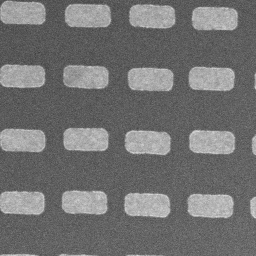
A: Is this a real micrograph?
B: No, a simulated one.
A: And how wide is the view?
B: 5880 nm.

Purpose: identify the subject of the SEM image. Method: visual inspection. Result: a regular array of raised bodies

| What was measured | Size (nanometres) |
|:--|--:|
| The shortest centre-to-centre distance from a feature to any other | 1430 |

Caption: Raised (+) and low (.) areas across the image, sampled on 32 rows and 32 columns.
+++++...........................
++++++..++++++..++++++..+++++...
+++++...++++++..++++++..++++++..
.........................++++...
................................
................................
................................
................................
+++++...+++++...........++......
+++++...+++++...++++++..+++++...
+++++...+++++...++++++..+++++...
................................
................................
................................
................................
................................
+++++...+++++...+++.....++++....
++++++..+++++...+++++...+++++...
+++++...+++++...+++++...+++++...
................................
................................
................................
................................
................................
+++++...+++++...+++++...+++++...
+++++...+++++...+++++...+++++..+
.++++....++++...+++++...+++++..+
................................
................................
................................
................................
................................